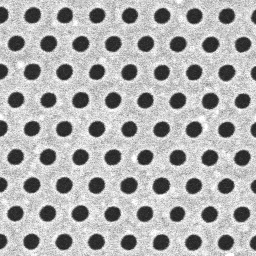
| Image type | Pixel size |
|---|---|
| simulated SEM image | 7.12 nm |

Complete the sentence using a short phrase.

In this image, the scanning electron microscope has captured a regular array of holes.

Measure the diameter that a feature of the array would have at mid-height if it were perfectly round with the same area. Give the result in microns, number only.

0.118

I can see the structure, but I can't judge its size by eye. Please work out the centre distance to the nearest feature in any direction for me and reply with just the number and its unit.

229 nanometers